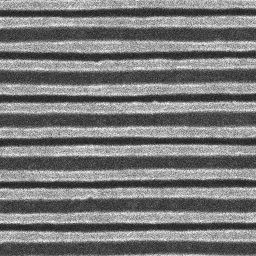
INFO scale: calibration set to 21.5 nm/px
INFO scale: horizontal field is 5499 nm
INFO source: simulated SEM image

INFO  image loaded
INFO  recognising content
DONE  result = parallel lines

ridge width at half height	236	nm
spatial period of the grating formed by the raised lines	460	nanometers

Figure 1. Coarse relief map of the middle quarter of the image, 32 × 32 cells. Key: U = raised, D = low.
UUUUUUUUUUUUUUUUUUUUUUUUUUUUUUUU
UUUUUUUUUUUUUUUDDDDDDDDDDDDDDDDD
DDDDDDDDDDDDDDDDDDDDDDDDDDDDDDDD
DDDDDDDDDDDDDDDDDDDDDDDDDDDDDDDD
DDDDDDDDDDDDDDDDDDDDDDDDDDDDDDDD
UUUUUUUUUUUUUUUUUUUUUUUUUUUUUUUU
UUUUUUUUUUUUUUUUUUUUUUUUUUUUUUUU
UUUUUUUUUUUUUUUUUUUUUUUUUUUUUDDU
DDDDDDDDDDDDDDDDDDDDDDDDDDDDDDDD
DDDDDDDDDDDDDDDDDDDDDDUUDUUUUDDD
UUUUUUUUUUUUUUUUUUUUUUUUUUUUUUUU
UUUUUUUUUUUUUUUUUUUUUUUUUUUUUUUU
DDDDDDDDDDDDDDDDDDDDDDDDDDDDDDDD
DDDDDDDDDDDDDDDDDDDDDDDDDDDDDDDD
DDDDDDDDDDDDDDDDDDDDDDDDDDDDDDDD
DDDDDDDDDDDDDDDDDDDDDDDDDDDDDDDD
UUUUUUUUUUUUUUUUUUUUUUUUUUUUUUUU
UUUUUUUUUUUUUUUUUUUUUUUUUUUUUUUU
DDDDDDDDDDDDDDDDDDDDDDUUDDDDDDDD
DDDDDDDDDDDDDDDDDDDDDDDDDDDDDDDD
DUUUUUUUUUUUUUUUUUUUUUUUUUUUUUUU
UUUUUUUUUUUUUUUUUUUUUUUUUUUUUUUU
UUUUUUUUUUUUUUUUUUUUUUUUUUUUUUUU
DDDDDDDDDDDDDDDDDDDDDDDDDDDDDDDD
DDDDDDDDDDDDDDDDDDDDDDDDDDDDDDDD
DDDDDDDDDDDDDDDDDDDDDDDDDDDDDDDD
DDDDDDDDDDDDDDDUUUUUUUUUUUUUUDDD
UUUUUUUUUUUUUUUUUUUUUUUUUUUUUUUU
UUUUUUUUUUUUUUUUUUUUUUUUUUUUUUUU
DDDDDDDDDDDDDDDDDDDDDDDDDDDDDDDD
DDDDDDDDDDDDDDDDDDDDDDDDDDDDDDDD
UUUUUUUUUUUUUUUUUUUUUUUUUUUUUUUU